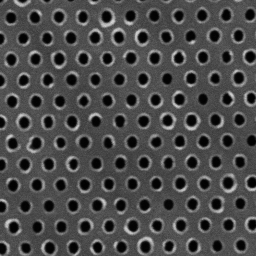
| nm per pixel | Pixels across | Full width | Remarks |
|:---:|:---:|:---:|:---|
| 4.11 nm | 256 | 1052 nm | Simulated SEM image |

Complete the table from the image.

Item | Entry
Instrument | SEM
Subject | a regular array of holes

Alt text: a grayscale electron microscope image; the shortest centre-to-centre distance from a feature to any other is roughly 97.1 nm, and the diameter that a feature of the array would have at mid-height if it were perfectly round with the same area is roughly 43.7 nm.